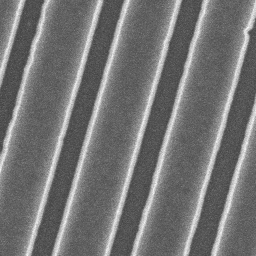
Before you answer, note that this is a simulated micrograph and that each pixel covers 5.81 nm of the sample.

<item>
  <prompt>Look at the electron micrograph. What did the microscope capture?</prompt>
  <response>one or a few lines or trenches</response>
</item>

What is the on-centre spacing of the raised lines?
441 nanometres